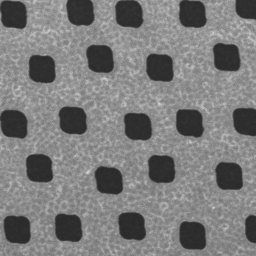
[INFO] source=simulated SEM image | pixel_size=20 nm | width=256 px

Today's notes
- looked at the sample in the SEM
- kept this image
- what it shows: a regular array of holes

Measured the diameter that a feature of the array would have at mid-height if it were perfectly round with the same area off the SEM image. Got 590 nanometers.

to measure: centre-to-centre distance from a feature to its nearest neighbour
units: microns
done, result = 1.17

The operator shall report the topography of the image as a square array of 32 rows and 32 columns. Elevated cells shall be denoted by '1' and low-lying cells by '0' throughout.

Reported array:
00011111000011100111110001111000
00011111000011000011110000111000
00011111100011100011110000111111
10011111111111111111111111111111
11111111111111111111111111111111
11111111111111111111111111101111
11111111111000111111111111100011
11110001111000111100001111100011
11110001111000111100001111100011
11110001111111111110001111111111
11111111111111111111111111111111
11111111111111111111111111111111
11111111111111111111111111111111
11111111001111111111111111111101
00011110000111110011110001111000
00011110000111110001110001111000
00011111000111110001110001111100
11111111111111111011111111111111
11111111111111111111111111111111
11110011111111111110011111111111
11100001111111111110001111100011
11100001111100011110001111100011
11110011111100011110001111100011
11111111111100011111111111110011
11111111111111111111111111111111
11111111111111111111111111111111
11111111111111110111111111111111
10001110001111100011111111111110
00001110001111100011110000111110
10001110001111100011110000111110
11111111111111111111111000111111
11111111111111111111111111111111